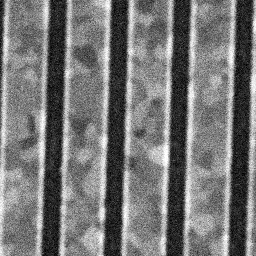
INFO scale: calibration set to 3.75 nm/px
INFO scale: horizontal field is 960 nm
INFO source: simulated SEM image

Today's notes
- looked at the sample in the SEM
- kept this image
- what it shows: parallel lines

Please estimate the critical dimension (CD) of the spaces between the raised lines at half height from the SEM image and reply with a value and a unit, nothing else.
81 nanometres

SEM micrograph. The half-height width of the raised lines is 0.151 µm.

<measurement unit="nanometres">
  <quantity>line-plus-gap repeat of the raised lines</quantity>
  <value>233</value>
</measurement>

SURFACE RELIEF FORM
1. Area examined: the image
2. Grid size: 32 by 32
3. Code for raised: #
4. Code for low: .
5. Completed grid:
.#####...#####..#####...#####...
.#####...#####..#####...#####...
.#####...#####..#####...#####...
.#####...#####..#####...#####...
.#####...#####..#####...#####...
.#####...####...#####...#####...
.#####...####...#####...#####...
.#####...####...#####...#####...
.#####..#####...#####...#####...
.#####..#####...#####...#####...
.####...#####...#####...#####...
.####...#####...#####...#####...
######..#####...#####...#####...
######..#####...#####...#####...
#####...#####...#####...#####...
#####...#####...#####...#####...
#####...#####...#####...#####..#
#####...#####...#####...#####...
#####...#####...#####...#####...
#####...#####...#####...#####..#
#####...#####...#####...#####..#
#####...#####...#####...#####..#
#####...#####...#####...#####..#
#####...#####...#####..######..#
#####...#####...#####..######..#
#####...#####...#####..#####...#
#####...#####...#####..#####...#
#####...#####...#####..#####...#
#####...#####...#####..#####...#
#####...#####...####...#####...#
#####...#####..#####...#####...#
#####...#####..#####...#####...#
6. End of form